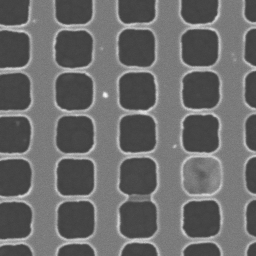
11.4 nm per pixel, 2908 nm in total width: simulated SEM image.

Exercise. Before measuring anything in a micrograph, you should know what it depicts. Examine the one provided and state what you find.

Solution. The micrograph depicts a regular array of holes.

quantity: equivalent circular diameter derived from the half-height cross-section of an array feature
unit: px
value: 40.5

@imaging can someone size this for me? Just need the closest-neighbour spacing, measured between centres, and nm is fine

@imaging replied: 483